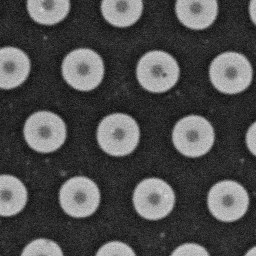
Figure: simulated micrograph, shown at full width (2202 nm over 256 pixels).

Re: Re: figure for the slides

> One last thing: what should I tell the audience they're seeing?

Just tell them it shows an array of small figures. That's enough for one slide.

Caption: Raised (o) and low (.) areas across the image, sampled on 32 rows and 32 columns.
...oooooo....ooooo....ooooo....o
....oooo.....ooooo....ooooo....o
....oooo.....oooo.....ooooo.....
........................oo......
................................
................................
ooo......ooo.......o............
oooo....ooooo.....oooo.....oooo.
oooo....ooooo....ooooo....ooooo.
ooo.....ooooo....ooooo....ooooo.
ooo......ooo......oooo.....oooo.
............................oo..
................................
................................
....ooo.......oo........o.......
...ooooo.....oooo.....oooo......
...ooooo....ooooo.....ooooo....o
...ooooo....ooooo.....ooooo....o
....ooo......oooo.....oooo.....o
.......................oo.......
................................
................................
oo.......oo.......oo............
ooo.....oooo.....oooo.....oooo..
ooo.....oooo.....ooooo....ooooo.
ooo.....oooo.....ooooo....ooooo.
oo......oooo.....oooo.....ooooo.
............................o...
................................
................................
....ooo......ooo.......o........
...ooooo....ooooo.....oooo.....o